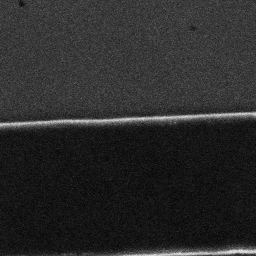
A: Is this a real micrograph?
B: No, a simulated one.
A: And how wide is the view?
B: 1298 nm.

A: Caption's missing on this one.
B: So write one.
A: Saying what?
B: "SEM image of one or a few lines or trenches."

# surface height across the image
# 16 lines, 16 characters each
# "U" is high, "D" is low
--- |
DDDDDDDDDDDDDDDD
DDDDDDDDDDDDDDDD
DDDDDDDDDDDDDDDD
DDDDDDDDDDDDDDDD
DDDDDDDDDDDDDDDD
DDDDDDDDDDDDDDDD
DDDDDDDDDDDDDDDD
DDDDDDDUUUUUUUUU
UUUUUUUUUUUUUUUU
UUUUUUUUUUUUUUUU
UUUUUUUUUUUUUUUU
UUUUUUUUUUUUUUUU
UUUUUUUUUUUUUUUU
UUUUUUUUUUUUUUUU
UUUUUUUUUUUUUUUU
UUUUUUUUUUUUUUUU